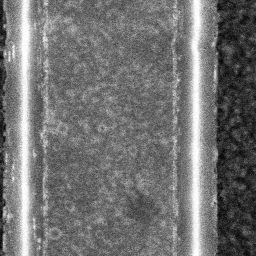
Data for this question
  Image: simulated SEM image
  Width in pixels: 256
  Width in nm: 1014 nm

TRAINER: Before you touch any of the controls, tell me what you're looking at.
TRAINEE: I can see one or a few lines or trenches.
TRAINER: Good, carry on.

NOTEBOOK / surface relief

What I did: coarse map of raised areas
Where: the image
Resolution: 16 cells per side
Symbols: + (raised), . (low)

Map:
..++++++++++....
..++++++++++....
..++++++++++....
..++++++++++....
..++++++++++....
..++++++++++....
..++++++++++....
..++++++++++....
..++++++++++....
..++++++++++....
..++++++++++....
..++++++++++....
..++++++++++....
..++++++++++....
..++++++++++....
..++++++++++....